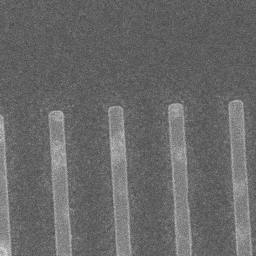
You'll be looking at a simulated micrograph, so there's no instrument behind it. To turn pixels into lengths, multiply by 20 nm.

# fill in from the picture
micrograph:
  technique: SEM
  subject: parallel lines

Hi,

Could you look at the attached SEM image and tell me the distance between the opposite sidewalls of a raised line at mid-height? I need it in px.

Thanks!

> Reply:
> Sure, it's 14.6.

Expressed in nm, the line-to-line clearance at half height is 915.